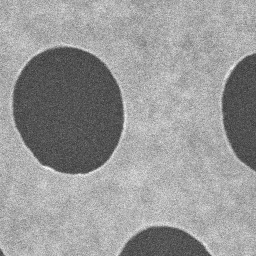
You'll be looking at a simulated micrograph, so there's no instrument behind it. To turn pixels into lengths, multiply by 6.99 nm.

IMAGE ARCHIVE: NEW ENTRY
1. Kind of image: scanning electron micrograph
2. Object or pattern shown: holes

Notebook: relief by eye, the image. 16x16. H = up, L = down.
HHHHHHHHHHHHHHHH
HHHHHHHHHHHHHHHH
HHHHHHHHHHHHHHHH
HHLLLLHHHHHHHHHL
HLLLLLLHHHHHHHLL
HLLLLLLHHHHHHHLL
HLLLLLLLHHHHHHLL
HLLLLLLLHHHHHHLL
HLLLLLLLHHHHHHLL
HHLLLLLHHHHHHHHL
HHHLLLHHHHHHHHHH
HHHHHHHHHHHHHHHH
HHHHHHHHHHHHHHHH
HHHHHHHHHHHHHHHH
HHHHHHHHHLLLHHHH
HHHHHHHHLLLLLHHH